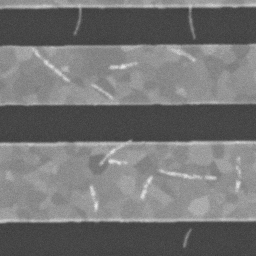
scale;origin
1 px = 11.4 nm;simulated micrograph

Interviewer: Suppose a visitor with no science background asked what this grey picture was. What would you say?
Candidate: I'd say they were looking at lines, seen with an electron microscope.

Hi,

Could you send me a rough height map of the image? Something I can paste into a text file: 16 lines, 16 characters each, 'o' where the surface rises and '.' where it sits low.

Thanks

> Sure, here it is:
................
................
................
oooooooooooooooo
oooooooooooooooo
oooooooooooooooo
ooooooooo.oo....
................
................
oooooooooooooooo
oooooooooooooooo
oooooooooooooooo
oooooooooooooooo
oooooooooooooooo
................
................